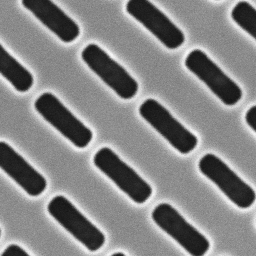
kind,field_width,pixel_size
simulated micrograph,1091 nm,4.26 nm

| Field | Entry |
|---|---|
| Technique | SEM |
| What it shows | holes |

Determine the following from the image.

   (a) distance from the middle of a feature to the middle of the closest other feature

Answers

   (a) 0.284 µm